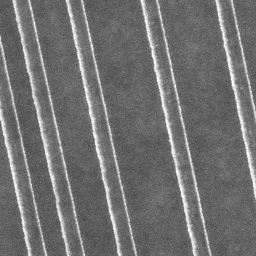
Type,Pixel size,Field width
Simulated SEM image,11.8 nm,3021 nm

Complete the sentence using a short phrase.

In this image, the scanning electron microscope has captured lines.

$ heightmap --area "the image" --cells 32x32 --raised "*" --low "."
..**....**........**.......**...
..**.....**.......**.......**...
..**.....**.......**........**..
..**.....**.......**........**..
...**....**........**.......**..
...**....***.......**.......**..
...**.....**.......**.......**..
*..**.....**.......**........**.
*..***....**.......**........**.
*...**....**........**.......**.
*...**.....**.......**.......**.
**..**.....**.......**.......**.
**..**.....**.......**........**
**...**....**.......***.......**
**...**....**........**.......**
**...**.....**.......**.......**
**...**.....**.......**.......**
.**..**.....**.......**........*
.**...**....**........**.......*
.**...**....**........**.......*
.**...**.....**.......**.......*
..**..**.....**.......**.......*
..**..***....**.......**........
..**...**....**........**.......
..**...**....**........**.......
..**...**.....**.......**.......
...**..**.....**.......**.......
...**...**....**.......**.......
...**...**....**........**......
...**...**....***.......**......
...**...**.....**.......**......
....**..**.....**.......**......